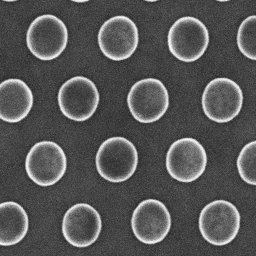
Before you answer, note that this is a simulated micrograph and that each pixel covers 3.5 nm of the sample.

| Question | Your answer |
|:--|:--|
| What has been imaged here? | a regular array of raised bodies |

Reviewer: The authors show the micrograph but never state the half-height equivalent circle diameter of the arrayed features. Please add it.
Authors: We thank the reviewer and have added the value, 144 nanometres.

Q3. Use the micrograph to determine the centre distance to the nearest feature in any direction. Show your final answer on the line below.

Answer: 241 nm